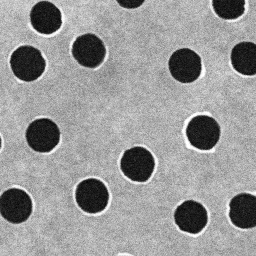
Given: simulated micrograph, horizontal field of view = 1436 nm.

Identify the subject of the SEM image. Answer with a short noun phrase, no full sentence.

a regular array of holes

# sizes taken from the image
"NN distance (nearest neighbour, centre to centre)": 369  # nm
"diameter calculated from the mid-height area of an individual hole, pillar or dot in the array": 192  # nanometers